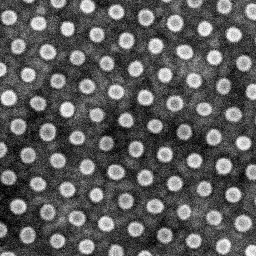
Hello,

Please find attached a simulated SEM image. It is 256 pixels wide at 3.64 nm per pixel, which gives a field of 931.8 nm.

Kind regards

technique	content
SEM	a regular array of raised bodies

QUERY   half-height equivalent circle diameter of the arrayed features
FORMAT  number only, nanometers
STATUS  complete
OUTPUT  50.8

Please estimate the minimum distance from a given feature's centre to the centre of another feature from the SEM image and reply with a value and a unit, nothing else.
0.108 microns